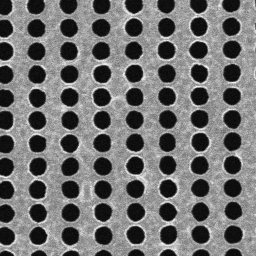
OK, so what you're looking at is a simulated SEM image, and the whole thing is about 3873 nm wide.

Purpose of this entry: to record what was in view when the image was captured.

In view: a regular array of holes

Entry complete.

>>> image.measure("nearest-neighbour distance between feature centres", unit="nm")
347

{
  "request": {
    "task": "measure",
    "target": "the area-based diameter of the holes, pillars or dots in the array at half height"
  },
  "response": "18.5 px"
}